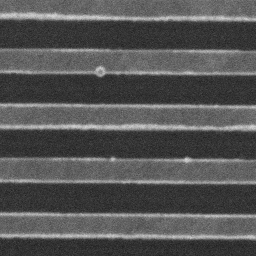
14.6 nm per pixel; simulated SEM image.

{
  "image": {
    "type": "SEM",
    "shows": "lines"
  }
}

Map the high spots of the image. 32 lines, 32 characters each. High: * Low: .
********************************
********************************
................................
................................
................................
................................
********************************
********************************
********************************
............*...................
................................
................................
................................
********************************
********************************
********************************
................................
................................
................................
................................
********************************
********************************
********************************
................................
................................
................................
................................
********************************
********************************
********************************
................................
................................